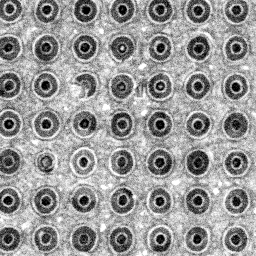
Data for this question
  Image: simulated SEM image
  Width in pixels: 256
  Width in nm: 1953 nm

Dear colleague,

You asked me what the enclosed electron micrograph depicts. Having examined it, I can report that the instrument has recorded a regular array of ring-shaped raised bodies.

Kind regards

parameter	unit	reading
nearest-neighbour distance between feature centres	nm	286